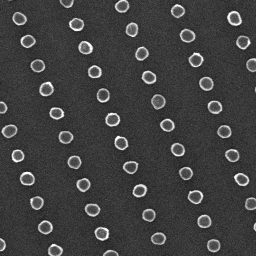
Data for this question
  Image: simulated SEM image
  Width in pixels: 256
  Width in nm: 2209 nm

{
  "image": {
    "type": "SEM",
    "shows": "a regular array of raised bodies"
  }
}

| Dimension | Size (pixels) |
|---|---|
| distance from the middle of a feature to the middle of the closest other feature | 25.2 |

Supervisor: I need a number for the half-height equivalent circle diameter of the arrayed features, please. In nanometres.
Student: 113